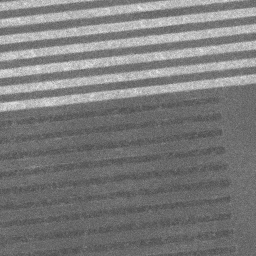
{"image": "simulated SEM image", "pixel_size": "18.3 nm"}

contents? parallel lines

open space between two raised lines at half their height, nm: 168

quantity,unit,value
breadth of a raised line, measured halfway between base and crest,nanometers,136